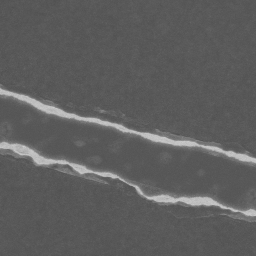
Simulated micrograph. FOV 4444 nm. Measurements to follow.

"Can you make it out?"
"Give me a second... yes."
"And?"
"one or a few lines or trenches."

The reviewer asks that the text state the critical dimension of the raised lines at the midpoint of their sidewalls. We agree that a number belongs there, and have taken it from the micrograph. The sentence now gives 905 nanometers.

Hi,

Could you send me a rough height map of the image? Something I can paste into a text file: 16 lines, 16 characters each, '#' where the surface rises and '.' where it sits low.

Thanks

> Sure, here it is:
................
................
................
................
................
................
##..............
######..........
#########.......
..############..
.....###########
........########
...........#####
................
................
................